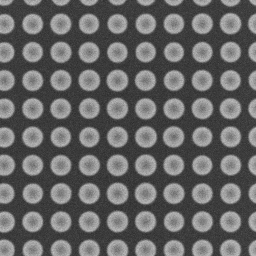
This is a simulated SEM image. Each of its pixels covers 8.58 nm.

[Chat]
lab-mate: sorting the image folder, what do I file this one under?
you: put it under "an array of small figures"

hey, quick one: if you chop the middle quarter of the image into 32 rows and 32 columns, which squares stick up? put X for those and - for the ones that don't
--------------------------------
--------------------------------
X---XXXX---XXXX---XXXX----XXX---
XX--XXXXX--XXXXX--XXXXX--XXXXX--
XX--XXXXX--XXXXX--XXXXX--XXXXX--
X---XXXXX--XXXXX--XXXXX--XXXXX--
-----XX-----XXX----XX------X----
--------------------------------
--------------------------------
X---XXXX---XXXX----XXX----XXX---
XX--XXXXX--XXXXX--XXXXX--XXXXX--
XX--XXXXX--XXXXX--XXXXX--XXXXX--
X---XXXX---XXXXX--XXXXX--XXXXX--
-----XX-----XXX-----X------X----
--------------------------------
--------------------------------
X----XXX----XXX----XXX----XXX---
XX--XXXXX--XXXXX--XXXXX--XXXXX--
XX--XXXXX--XXXXX--XXXXX--XXXXX--
X---XXXX---XXXXX--XXXXX--XXXXX--
-----XX-----XX-----XXX----XX----
--------------------------------
--------------------------------
X----XXX----XXX----XXX----XXX---
XX--XXXXX--XXXXX--XXXXX--XXXXX--
XX--XXXXX--XXXXX--XXXXX--XXXXX--
X---XXXXX--XXXXX--XXXXX--XXXXX--
-----XX-----XXX----XXX-----X----
--------------------------------
--------------------------------
X----XXX----XXX----XXX----XXX---
XX--XXXXX--XXXXX--XXXXX--XXXXX--